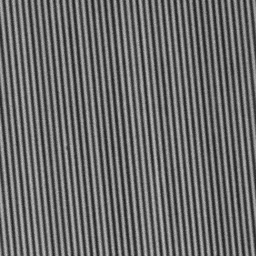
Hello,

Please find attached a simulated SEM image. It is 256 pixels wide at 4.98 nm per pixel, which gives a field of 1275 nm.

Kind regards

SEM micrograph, parallel lines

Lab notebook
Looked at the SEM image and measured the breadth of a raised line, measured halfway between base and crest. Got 13.6 nm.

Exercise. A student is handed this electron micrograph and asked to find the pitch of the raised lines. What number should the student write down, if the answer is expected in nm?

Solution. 31.4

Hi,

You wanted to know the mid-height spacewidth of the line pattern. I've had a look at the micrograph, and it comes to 18 nanometers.